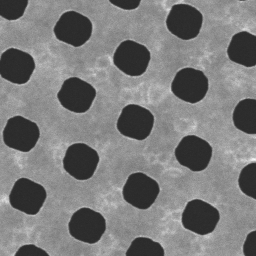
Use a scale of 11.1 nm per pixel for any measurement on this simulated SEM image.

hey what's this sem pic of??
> a regular array of holes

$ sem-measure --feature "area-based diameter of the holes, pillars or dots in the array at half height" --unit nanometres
402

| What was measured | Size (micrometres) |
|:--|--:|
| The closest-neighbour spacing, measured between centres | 0.71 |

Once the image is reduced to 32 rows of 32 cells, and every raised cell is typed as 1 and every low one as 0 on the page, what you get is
00011111111111000111111111111111
00011111001111111111100001111111
10111110000111111111100001111111
11111110000011111111100001111111
11111110000111111111110001111000
11111111001111100111111111111000
00011111111111000001111111110000
00001111111111000001111111111000
00001111111111100011111011111111
00001111111111111111110000111111
11011111000111111111100000111111
11111110000011111111110000111111
11111110000011111111111001111100
11111111000111100011111111111000
11011111111111100001111111111000
10001111111111100001111111111000
00000111111111100001111111111100
00000111111111111011111000111111
10001111100111111111110000111111
11111111000011111111110000111111
11111111000011111111111000111110
11111111000011111111111111111100
11001111111111110001111111111100
10000111111111100000111111111100
10000011111111100000111111111110
10000111111111110001111000111111
11100111100011111111111000011111
11111111100001111111111000011111
11111111100001111111111000011111
11111111100001111111111111111110
11111111111111110000111111111100
11000011111111110000011111111100